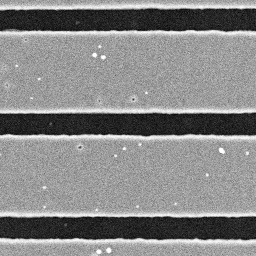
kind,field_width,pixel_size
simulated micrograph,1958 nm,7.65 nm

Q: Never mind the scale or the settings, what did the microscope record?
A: lines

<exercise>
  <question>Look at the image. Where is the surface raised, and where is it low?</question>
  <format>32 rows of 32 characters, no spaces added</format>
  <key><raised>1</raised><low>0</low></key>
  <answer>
11111111111111111111111111111111
00000000000000000000000000000000
00000000000000000000000000000000
00000000000000000000000000000000
11111111111111111111111111111111
11111111111111111111111111111111
11111111111111111111111111111111
11111111111111111111111111111111
11111111111111111111111111111111
11111111111111111111111111111111
11111111111111111111111111111111
11111111111111111111111111111111
11111111111111111111111111111111
11111111111111111111111111111111
00000000000000000000000000000000
00000000000000000000000000000000
00000000000000000000000000000000
11111111111111111111111111111111
11111111111111111111111111111111
11111111111111111111111111111111
11111111111111111111111111111111
11111111111111111111111111111111
11111111111111111111111111111111
11111111111111111111111111111111
11111111111111111111111111111111
11111111111111111111111111111111
11111111111111111111111111111111
00000000000000000000000000000000
00000000000000000000000000000000
00000000000000000000000000000000
11111111111111111111111111111111
11111111111111111111111111111111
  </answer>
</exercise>